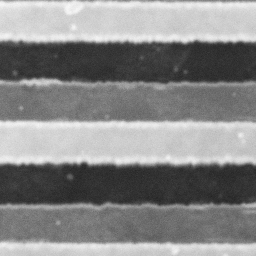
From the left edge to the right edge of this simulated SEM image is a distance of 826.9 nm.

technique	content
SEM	lines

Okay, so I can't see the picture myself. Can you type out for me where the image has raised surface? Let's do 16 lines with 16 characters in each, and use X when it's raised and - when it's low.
XXXXXXXXXXXXXXXX
XXXXXXXXXXXXXXXX
XXXXXXXXXXXXXXXX
----------------
----------------
XXXXXXXXXXXXXXXX
XXXXXXXXXXXXXXXX
XXXXXXXXXXXXXXXX
XXXXXXXXXXXXXXXX
XXXXXXXXXXXXXXXX
----------------
----------------
----------------
XXXXXXXXXXXXXXXX
XXXXXXXXXXXXXXXX
XXXXXXXXXXXXXXXX